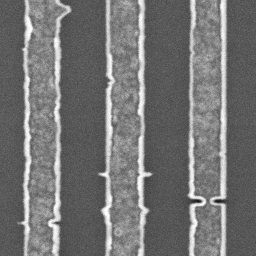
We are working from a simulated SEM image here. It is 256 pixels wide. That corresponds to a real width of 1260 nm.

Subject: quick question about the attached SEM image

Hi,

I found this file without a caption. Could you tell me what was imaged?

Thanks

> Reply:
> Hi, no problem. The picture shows one or a few lines or trenches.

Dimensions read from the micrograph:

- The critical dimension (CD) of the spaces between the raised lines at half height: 238 nm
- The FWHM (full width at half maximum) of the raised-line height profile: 34 pixels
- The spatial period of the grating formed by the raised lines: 407 nm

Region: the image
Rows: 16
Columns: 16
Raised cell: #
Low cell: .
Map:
..##...##...##..
..##...##...##..
..##...##...##..
..##...##...##..
..##...##...##..
..##...##...##..
..##...##...##..
..##...##...##..
..##...##...##..
..##...##...##..
..##...##...##..
..##...##...##..
..##...##...##..
..##...##...##..
..##...##...##..
..##...##...##..